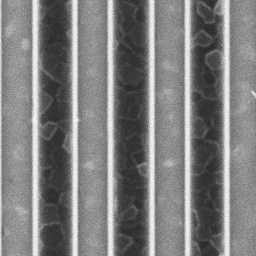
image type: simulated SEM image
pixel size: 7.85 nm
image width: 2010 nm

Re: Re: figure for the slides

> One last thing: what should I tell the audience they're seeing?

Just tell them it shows one or a few lines or trenches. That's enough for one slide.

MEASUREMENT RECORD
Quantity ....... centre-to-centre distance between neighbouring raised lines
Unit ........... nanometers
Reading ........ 595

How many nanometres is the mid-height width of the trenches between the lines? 269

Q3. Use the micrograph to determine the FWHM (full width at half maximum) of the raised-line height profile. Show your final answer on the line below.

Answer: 322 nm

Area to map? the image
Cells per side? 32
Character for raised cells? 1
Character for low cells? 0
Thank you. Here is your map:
00001111100000111110000111110000
00001111100000111110000111110000
00001111100000111110000111110000
00001111100000111110000111110000
00001111100000111110000111110000
00001111100000111110000111110000
00001111100000111110000111110000
00001111100000111110000111110000
00001111100000111110000111110000
00001111100000111110000111110000
00001111100000111110000111110000
00001111100000111110000111110000
00001111100000111110000111110000
00001111100000111110000111110000
00001111110000111110000111110000
00001111110000111110000111110000
00001111100000111110000111110000
00001111100000111110000111110000
00001111100000111110000111110000
00001111100000111110000111110000
00001111100000111110000111110000
00001111100000111110000111110000
00001111100000111110000111110000
00001111100000111110000111110000
00001111100000111110000111110000
00001111100000111110000111110000
00001111100000111110000111110000
00001111100000111110000111110000
00001111100000111110000111110000
00001111100000111110000111110000
00001111100000111110000111110000
00001111100000111110000111110000